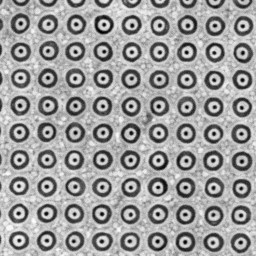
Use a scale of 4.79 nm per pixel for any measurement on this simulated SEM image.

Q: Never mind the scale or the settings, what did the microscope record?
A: a regular array of ring-shaped grooves with a dot in the middle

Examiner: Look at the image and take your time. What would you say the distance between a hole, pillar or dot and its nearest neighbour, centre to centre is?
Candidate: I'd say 128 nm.